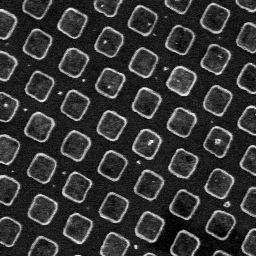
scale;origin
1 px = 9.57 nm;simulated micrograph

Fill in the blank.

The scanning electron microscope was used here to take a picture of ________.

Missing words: a regular array of raised bodies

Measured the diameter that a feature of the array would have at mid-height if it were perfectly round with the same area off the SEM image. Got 26.9 px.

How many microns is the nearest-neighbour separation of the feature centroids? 0.386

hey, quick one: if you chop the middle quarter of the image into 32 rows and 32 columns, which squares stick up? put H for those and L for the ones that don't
HHHHHLLLLLLLLLLLHHHHHHHLLLLLLLLL
HHHHHLLLLLHHLLLLLHHHHHLLLLLHHHHL
LHHHLLLLLHHHHHHLLLHHHLLLLLLHHHHH
LLLLLLLLLHHHHHHLLLLLLLLLLLHHHHHH
LLLLLLLLHHHHHHHLLLLLLLLLLLHHHHHH
LLLLLLLLHHHHHHLLLLLLLLLLLLHHHHHH
LLLLLLLLHHHHHHLLLLLHHLLLLLLHHHHH
LHHHLLLLLLHHHLLLLLLHHHHLLLLLLHHL
HHHHHHLLLLLLLLLLLLHHHHHHLLLLLLLL
HHHHHHLLLLLLLLLLLLHHHHHHLLLLLLLL
HHHHHHLLLLLLLLLLLHHHHHHLLLLLLLLL
HHHHHLLLLLLLLLLLLHHHHHHLLLLLHHLL
HHHHHLLLLLHHHLLLLLLHHHLLLLLHHHHH
LLHHLLLLLLHHHHHLLLLLLLLLLLLHHHHH
LLLLLLLLLHHHHHHLLLLLLLLLLLHHHHHH
LLLLLLLLLHHHHHHLLLLLLLLLLLHHHHHH
LLLLLLLLHHHHHHLLLLLLHLLLLLHHHHHH
LHHHLLLLLHHHHHLLLLLHHHHLLLLLHHHL
LHHHHHLLLLLHHLLLLLHHHHHHLLLLLLLL
HHHHHHLLLLLLLLLLLLHHHHHHLLLLLLLL
HHHHHHLLLLLLLLLLLHHHHHHHLLLLLLLL
HHHHHHLLLLLLLLLLLHHHHHHLLLLLHHLL
HHHHHLLLLLHHHLLLLLLHHHHLLLLLHHHH
LLHHLLLLLLHHHHHLLLLLHHLLLLLHHHHH
LLLLLLLLLHHHHHHHLLLLLLLLLLLHHHHH
LLLLLLLLLHHHHHHLLLLLLLLLLLHHHHHH
LLLLLLLLLHHHHHHLLLLLLLLLLLHHHHHH
LLHHLLLLLHHHHHLLLLLHHHHLLLLLHHHH
LHHHHHLLLLLHHHLLLLLHHHHHLLLLLLLL
LHHHHHHLLLLLLLLLLLHHHHHHHLLLLLLL
HHHHHHHLLLLLLLLLLLHHHHHHLLLLLLLL
HHHHHHLLLLLLLLLLLLHHHHHHLLLLLLLL